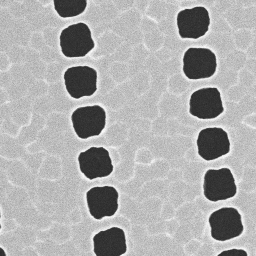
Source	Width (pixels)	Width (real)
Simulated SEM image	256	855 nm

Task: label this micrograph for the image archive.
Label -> a regular array of holes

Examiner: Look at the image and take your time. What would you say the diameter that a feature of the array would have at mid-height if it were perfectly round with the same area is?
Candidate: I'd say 112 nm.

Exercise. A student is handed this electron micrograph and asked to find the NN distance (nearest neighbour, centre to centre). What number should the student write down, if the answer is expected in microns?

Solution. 0.135